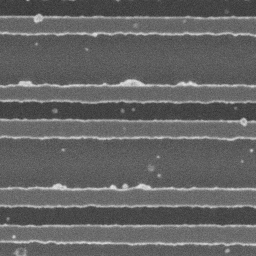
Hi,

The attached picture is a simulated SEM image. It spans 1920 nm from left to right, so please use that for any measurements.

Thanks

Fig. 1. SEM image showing lines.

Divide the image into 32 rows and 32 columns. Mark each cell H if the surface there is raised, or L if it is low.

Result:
LLLLLLLLLLLLLLLLLLLLLLLLLLLLLLLL
LLLLLLLLLLLLLLLLLLLLLLLLLLLLLLLL
HHHHHHHHHHHHHHHHHHHHHHHHHHHHHHHH
HHHHHHHHHHHHHHHHHHHHHHHHHHHHHHHH
LLLLLLLLLLLLLLLLLLLLLLLLLLLLLLLL
LLLLLLLLLLLLLLLLLLLLLLLLLLLLLLLL
LLLLLLLLLLLLLLLLLLLLLLLLLLLLLLLL
LLLLLLLLLLLLLLLLLLLLLLLLLLLLLLLL
LLLLLLLLLLLLLLLLLLLLLLLLLLLLLLLL
LLLLLLLLLLLLLLLLLLLLLLLLLLLLLLLL
LLLLLLLLLLLLLLLLHLLLLLLLLLLLLLLL
HHHHHHHHHHHHHHHHHHHHHHHHHHHHHHHH
HHHHHHHHHHHHHHHHHHHHHHHHHHHHHHHH
LLLLLLLLLLLLLLLLLLLLLLLLLLLLLLLL
LLLLLLLLLLLLLLLLLLLLLLLLLLLLLLLL
HHHHHHHHHHHHHHHHHHHHHHHHHHHHHHHH
HHHHHHHHHHHHHHHHHHHHHHHHHHHHHHHH
LLLLLLLLLLLLLLLLLLLLLLLLLLLLLLLL
LLLLLLLLLLLLLLLLLLLLLLLLLLLLLLLL
LLLLLLLLLLLLLLLLLLLLLLLLLLLLLLLL
LLLLLLLLLLLLLLLLLLLLLLLLLLLLLLLL
LLLLLLLLLLLLLLLLLLLLLLLLLLLLLLLL
LLLLLLLLLLLLLLLLLLLLLLLLLLLLLLLL
LHHHHHHHLLLHLHLLHHLLHHLLHLHHLLLL
HHHHHHHHHHHHHHHHHHHHHHHHHHHHHHHH
HHHHHHHHHHHHHHHHHHHHHHHHHHHHHHHH
LLLLLLLLLLLLLLLLLLLLLLLLLLLLLLLL
LLLLLLLLLLLLLLLLLLLLLLLLLLLLLLLL
HHHHHHHHHHHHHHHHHHHHHHHHHHHHHHHH
HHHHHHHHHHHHHHHHHHHHHHHHHHHHHHHH
LLLLLLLLLLLLLLLLHHHLHHHLHHHHHHHH
LLLLLLLLLLLLLLLLLLLLLLLLLLLLLLLL